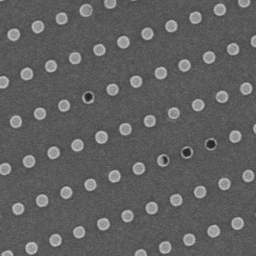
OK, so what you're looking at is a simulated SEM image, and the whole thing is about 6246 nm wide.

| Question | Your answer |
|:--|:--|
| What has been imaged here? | a regular array of raised bodies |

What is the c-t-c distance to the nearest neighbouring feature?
618 nm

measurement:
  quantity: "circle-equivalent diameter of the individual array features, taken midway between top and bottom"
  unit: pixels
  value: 11.3